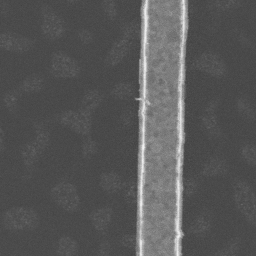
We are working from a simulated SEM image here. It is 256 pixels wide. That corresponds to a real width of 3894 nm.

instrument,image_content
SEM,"one or a few lines or trenches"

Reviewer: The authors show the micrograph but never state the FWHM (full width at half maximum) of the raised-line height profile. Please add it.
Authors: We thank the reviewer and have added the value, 0.553 um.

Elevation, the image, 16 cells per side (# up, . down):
.........##.....
.........##.....
.........##.....
.........##.....
.........##.....
.........##.....
.........##.....
.........##.....
.........##.....
.........##.....
.........##.....
.........##.....
.........##.....
.........##.....
.........##.....
.........##.....